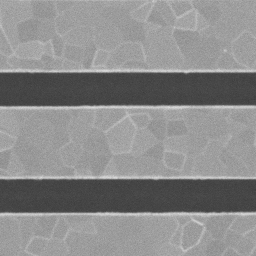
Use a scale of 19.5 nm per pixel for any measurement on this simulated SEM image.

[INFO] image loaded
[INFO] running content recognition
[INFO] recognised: lines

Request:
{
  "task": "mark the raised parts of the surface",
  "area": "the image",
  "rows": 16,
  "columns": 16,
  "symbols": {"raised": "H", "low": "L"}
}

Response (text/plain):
HHHHHHHHHHHHHHHH
HHHHHHHHHHHHHHHH
HHHHHHHHHHHHHHHH
HHHHHHHHHHHHHHHH
LLLLLLLLLLLLLLLL
LLLLLLLLLLLLLLLL
LLLLLLLLLLLLLLLL
HHHHHHHHHHHHHHHH
HHHHHHHHHHHHHHHH
HHHHHHHHHHHHHHHH
HHHHHHHHHHHHHHHH
LLLLLLLLLLLLLLLL
LLLLLLLLLLLLLLLL
HHHHHHHHHHHHHHHH
HHHHHHHHHHHHHHHH
HHHHHHHHHHHHHHHH